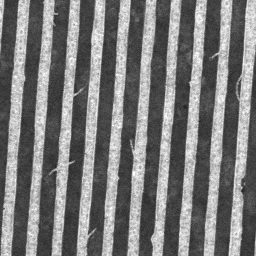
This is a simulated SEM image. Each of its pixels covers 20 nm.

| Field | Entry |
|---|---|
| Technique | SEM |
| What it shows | parallel lines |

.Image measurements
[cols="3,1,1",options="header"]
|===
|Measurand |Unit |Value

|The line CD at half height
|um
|0.195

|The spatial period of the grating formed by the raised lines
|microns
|0.507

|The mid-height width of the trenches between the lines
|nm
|316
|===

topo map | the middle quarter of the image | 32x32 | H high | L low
LHHLLLLHHLLLLHHLLLLHHHLLLLHHLLLL
HHHLLLLHHLLLLHHLLLLHHLLLLLHHLLLL
HHHLLLLHHLLLLHHLLLLHHLLLLLHHLLLL
HHHLLLLHHLLLLHHLLLLHHLLLLLHHLLLL
HHLLLLLHHLLLLHHLLLLHHLLLLLHHLLLL
HHLLLLLHHLLLLHHLLLLHHLLLLLHHLLLL
HHLLLLHHLLLLLHHLLLLHHLLLLLHHLLLL
HHHLLLHHLLLLLHHLLLLHHLLLLLHLLLLL
HHLLLLHHLLLLLHHLLLLHHLLLLLHHLLLL
HHLLLLHHLLLLLHHLLLLHHLLLLHHHLLLH
HHLLLLHHLLLLLHHLLLLHHLLLLHHLLLLH
HHLLLLHHLLLLLHHLLLLHHLLLLHHLLLLH
HHLLLLHHLLLLHHHLLLLHHLLLLHHLLLLH
HHLLLLHHLLLLHHHLLLLHHLLLLHHLLLLH
HHLLLLHHLLLLHHHLLLHHHLLLLHHLLLLH
HHLLLLHHLLLLHHLLLLHHHLLLLHHLLLLH
HHLLLLHHLLLLHHLLLLHHHLLLLHHLLLLH
HLLLLLHHLLLLHHLLLLHHHLLLLHHLLLLH
HHLLLLHHLLLLHHLLLLHHHLLLLHHLLLLH
HLLLLLHHLLLLHHLLLLHHHLLLLHHLLLLH
HLLLLHHLLLLLHHLLLLHHLLLLHHLLLLLH
HLLLLHHLLLLLHHLLLLHHLLLLHHLLLLLH
HLLLLHHHLLLHHHLLLHHHLLLLHHLLLLLH
HLLLLHHLLLLHHHLLLHHHLLLLHHLLLLHH
HLLLLHHLLLLHHHLLLLHHLLLLHHLLLLHH
HLLLLHHLLLLHHHLLLHHHLLLLHHLLLLHH
HLLLLHHLLLLHHLLLLHHHLLLLHHLLLLHH
HLLLLHHLLLLHHLLLLHHHLLLLHHLLLLHH
HLLLLHHLLLLHHLLLLHHHLLLLHHLLLLHH
HLLLLHHLLLLHHLLLLHHHLLLLHHLLLLHH
HLLLLHHLLLLHHLLLLHHHLLLLHHLLLLHH
LLLLLHHLLLLHHLLLLHHHLLLHHHLLLLHH